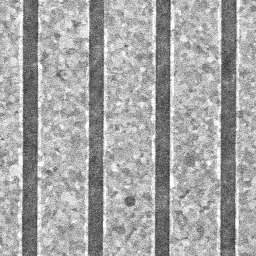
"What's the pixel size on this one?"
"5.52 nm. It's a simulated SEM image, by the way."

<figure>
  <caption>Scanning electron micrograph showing one or a few lines or trenches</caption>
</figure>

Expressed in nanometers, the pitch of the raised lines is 364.